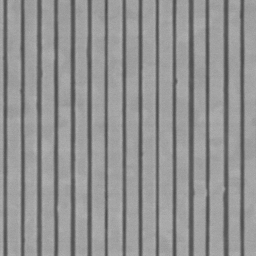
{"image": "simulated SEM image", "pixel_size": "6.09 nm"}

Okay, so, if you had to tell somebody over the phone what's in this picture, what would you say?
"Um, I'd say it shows parallel lines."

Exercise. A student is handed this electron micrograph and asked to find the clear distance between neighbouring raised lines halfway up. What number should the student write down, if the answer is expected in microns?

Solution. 0.0228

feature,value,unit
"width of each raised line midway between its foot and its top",79.2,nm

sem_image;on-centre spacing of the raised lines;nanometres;103